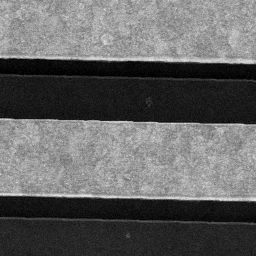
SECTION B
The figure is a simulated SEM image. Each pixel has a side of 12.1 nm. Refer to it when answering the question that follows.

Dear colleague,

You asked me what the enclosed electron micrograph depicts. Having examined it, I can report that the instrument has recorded lines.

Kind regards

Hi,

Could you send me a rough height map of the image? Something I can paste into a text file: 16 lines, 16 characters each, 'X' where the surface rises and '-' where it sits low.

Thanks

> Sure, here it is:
XXXXXXXXXXXXXXXX
XXXXXXXXXXXXXXXX
XXXXXXXXXXXXXXXX
XXXXXXXXXXXXXXXX
----------------
----------------
----------------
XXXX------------
XXXXXXXXXXXXXXXX
XXXXXXXXXXXXXXXX
XXXXXXXXXXXXXXXX
XXXXXXXXXXXXXXXX
-------------XXX
----------------
----------------
----------------